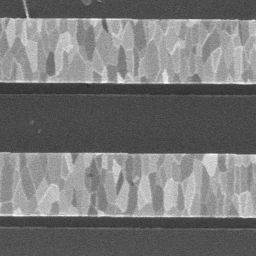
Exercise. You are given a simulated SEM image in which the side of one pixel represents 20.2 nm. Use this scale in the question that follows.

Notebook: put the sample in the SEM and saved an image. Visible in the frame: lines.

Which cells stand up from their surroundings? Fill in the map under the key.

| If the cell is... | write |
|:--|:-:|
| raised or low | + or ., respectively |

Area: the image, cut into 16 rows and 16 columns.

................
++++++++++++++++
++++++++++++++++
++++++++++++++++
++++++++++++++++
................
................
................
................
................
++++++++++++++++
++++++++++++++++
++++++++++++++++
......++++++++++
................
................